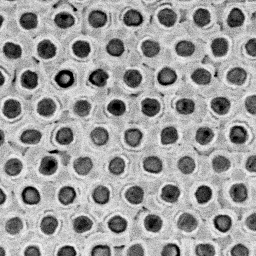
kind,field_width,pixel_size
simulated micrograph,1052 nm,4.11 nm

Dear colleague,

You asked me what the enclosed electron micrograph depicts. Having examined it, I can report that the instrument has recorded a regular array of holes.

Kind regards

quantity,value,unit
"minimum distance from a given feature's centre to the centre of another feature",136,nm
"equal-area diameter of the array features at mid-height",77.2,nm